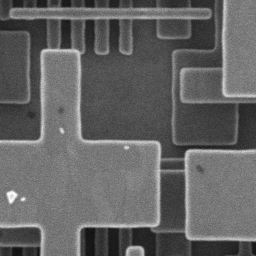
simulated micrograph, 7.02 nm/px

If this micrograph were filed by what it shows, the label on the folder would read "wiring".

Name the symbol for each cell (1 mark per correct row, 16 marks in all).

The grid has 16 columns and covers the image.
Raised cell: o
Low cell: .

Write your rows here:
..............oo
..............oo
..............oo
...oo.........oo
...oo.........oo
...oo.........oo
...oo...........
...oo...........
..ooo...........
oooooooooo..oooo
oooooooooo..oooo
oooooooooo..oooo
oooooooooo..oooo
oooooooooo..oooo
..ooo.......oooo
...oo...o.......